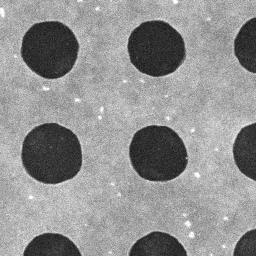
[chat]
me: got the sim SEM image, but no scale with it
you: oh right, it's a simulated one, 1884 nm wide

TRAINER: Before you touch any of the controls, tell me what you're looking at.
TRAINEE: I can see holes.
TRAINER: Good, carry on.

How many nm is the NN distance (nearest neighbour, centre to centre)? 771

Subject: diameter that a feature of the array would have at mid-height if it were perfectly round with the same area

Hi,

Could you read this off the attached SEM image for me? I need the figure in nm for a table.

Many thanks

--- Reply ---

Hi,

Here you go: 424